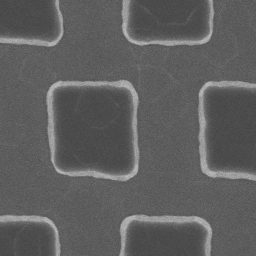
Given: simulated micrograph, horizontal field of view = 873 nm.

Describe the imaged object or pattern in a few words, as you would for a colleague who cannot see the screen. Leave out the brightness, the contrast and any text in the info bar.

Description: raised bodies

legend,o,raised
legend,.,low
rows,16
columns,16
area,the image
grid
oooo....ooooo...
oooo....ooooo...
oooo....ooooo...
................
................
...ooooo.....ooo
...oooooo....ooo
...ooooo.....ooo
...oooooo....ooo
...oooooo....ooo
....oooo.....ooo
................
................
................
oooo....ooooo...
oooo....ooooo...